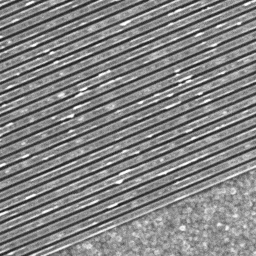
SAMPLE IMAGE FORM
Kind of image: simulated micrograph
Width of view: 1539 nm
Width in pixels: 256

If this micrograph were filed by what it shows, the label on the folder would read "parallel lines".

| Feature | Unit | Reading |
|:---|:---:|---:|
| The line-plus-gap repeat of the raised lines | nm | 59.5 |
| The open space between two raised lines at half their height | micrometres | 0.0222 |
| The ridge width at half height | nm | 39.5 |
